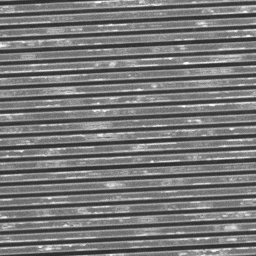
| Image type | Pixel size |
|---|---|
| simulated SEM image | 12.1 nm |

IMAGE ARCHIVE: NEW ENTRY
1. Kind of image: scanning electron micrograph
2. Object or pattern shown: parallel lines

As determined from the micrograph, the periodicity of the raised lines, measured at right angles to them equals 146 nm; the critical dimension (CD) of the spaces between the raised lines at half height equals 54.4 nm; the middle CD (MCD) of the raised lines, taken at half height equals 87.6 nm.